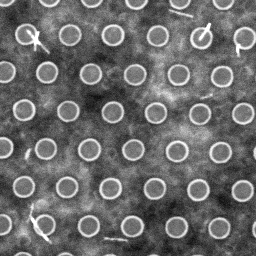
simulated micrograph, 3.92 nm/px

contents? a regular array of raised bodies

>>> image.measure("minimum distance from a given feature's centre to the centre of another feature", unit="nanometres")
169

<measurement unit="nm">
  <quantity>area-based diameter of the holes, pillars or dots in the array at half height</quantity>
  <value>80.8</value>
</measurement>